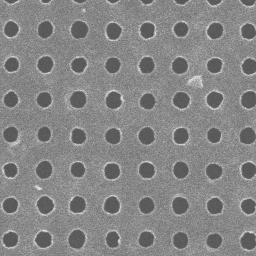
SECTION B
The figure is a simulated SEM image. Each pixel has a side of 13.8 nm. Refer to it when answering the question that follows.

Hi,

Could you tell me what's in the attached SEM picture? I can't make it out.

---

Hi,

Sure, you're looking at a regular array of holes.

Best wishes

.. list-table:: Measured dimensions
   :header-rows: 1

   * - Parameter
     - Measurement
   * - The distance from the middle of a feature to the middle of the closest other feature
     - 460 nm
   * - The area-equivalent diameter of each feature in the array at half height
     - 217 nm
